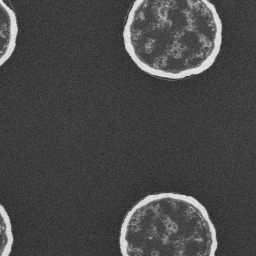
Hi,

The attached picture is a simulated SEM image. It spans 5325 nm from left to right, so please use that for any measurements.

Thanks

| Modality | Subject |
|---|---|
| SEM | raised bodies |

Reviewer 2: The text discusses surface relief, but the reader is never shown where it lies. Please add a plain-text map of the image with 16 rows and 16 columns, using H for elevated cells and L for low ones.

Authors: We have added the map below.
LLLLLLLLHHHHHLLL
HLLLLLLLHHHHHHLL
HLLLLLLLHHHHHHLL
LLLLLLLLHHHHHLLL
LLLLLLLLLLHHLLLL
LLLLLLLLLLLLLLLL
LLLLLLLLLLLLLLLL
LLLLLLLLLLLLLLLL
LLLLLLLLLLLLLLLL
LLLLLLLLLLLLLLLL
LLLLLLLLLLLLLLLL
LLLLLLLLLLLLLLLL
LLLLLLLLLHHHLLLL
LLLLLLLLHHHHHLLL
HLLLLLLLHHHHHLLL
HLLLLLLLHHHHHLLL